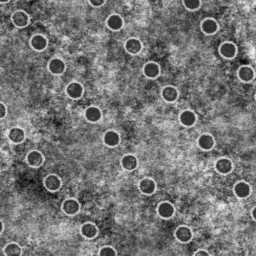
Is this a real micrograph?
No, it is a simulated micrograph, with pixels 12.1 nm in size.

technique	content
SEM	a regular array of raised bodies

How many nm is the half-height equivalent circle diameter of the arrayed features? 209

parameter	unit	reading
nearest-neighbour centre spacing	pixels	29.9